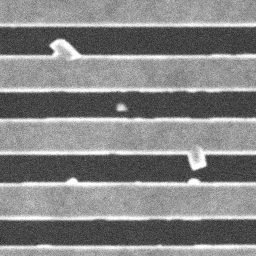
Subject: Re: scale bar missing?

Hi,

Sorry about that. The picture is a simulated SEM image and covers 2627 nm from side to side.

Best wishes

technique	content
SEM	lines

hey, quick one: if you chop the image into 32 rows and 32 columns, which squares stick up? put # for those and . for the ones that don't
################################
################################
################################
................................
................................
.......##.......................
.......###......................
################################
################################
################################
################################
................................
................................
................................
................................
################################
################################
################################
################################
.......................###......
........................##......
................................
................................
################################
################################
################################
################################
................................
................................
................................
................................
################################